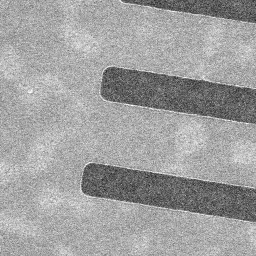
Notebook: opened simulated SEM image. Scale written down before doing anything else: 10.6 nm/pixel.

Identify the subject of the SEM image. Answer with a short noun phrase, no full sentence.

one or a few lines or trenches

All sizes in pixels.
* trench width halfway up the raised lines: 62.8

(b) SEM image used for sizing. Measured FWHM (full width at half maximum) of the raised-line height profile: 369 nm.